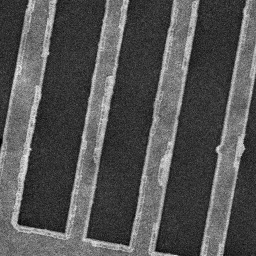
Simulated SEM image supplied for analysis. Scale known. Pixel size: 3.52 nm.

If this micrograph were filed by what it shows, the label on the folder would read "one or a few lines or trenches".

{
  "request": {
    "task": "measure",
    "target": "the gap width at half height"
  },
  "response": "0.169 microns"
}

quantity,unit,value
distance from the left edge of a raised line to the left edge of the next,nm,247